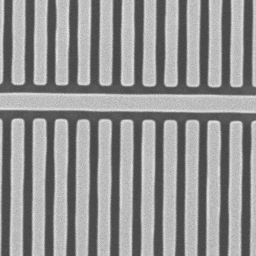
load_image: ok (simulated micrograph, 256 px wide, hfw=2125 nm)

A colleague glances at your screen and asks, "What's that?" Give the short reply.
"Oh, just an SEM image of groups of lines, slits or small figures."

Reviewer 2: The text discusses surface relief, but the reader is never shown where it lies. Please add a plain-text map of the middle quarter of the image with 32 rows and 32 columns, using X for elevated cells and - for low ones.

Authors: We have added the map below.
X---XX---XXX---XX---XXX--XXX---X
X---XX---XXX---XX---XXX--XXX---X
X---XX---XXX--XXX---XXX--XXX---X
X---XX---XXX--XXX---XXX--XXX---X
X---XX---XXX--XXX---XXX--XXX---X
--------------------------XX---X
--------------------------------
--------------------------------
XXXXXXXXXXXXXXXXXXXXXXXXXXXXXXXX
XXXXXXXXXXXXXXXXXXXXXXXXXXXXXXXX
XXXXXXXXXXXXXXXXXXXXXXXXXXXXXXXX
----XXXXXXXXXXXXXXXXXXXXXXXXXXXX
--------------------------------
--------------------------------
X---XX---XXX--XXX---XX---XXX---X
X--XXX---XXX--XXX---XXX--XXX---X
X--XXX---XXX--XXX---XXX--XXX---X
X--XXX---XXX--XXX---XXX--XXX---X
X--XXX---XXX--XXX---XXX--XXX---X
X--XXX---XXX--XXX---XXX--XXX---X
X--XXX---XXX--XXX---XXX--XXX---X
X--XXX---XXX--XXX---XXX--XXX---X
X--XXX---XXX--XXX---XXX--XXX---X
X--XXX---XXX--XXX---XXX--XXX---X
X--XXX---XXX--XXX---XXX--XXX---X
X--XXX---XXX--XXX---XXX--XXX---X
X--XXX---XXX--XXX---XXX--XXX---X
X--XXX---XXX--XXX---XXX--XXX---X
X--XXX---XXX--XXX---XXX--XXX---X
X--XXX---XXX--XXX---XXX--XXX---X
X--XXX---XXX--XXX---XX---XXX---X
X--XXX---XXX--XXX---XX---XXX---X